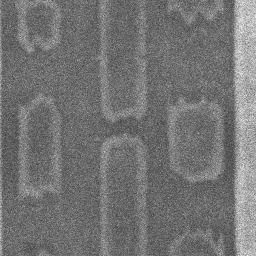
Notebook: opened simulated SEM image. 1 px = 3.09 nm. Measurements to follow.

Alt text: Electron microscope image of one or a few lines or trenches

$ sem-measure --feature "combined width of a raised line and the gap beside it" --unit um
0.242